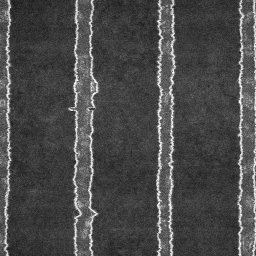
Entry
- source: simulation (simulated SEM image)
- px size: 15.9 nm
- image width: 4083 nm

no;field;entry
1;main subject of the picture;one or a few lines or trenches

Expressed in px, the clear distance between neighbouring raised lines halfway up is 68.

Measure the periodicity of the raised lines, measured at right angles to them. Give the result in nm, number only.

1300